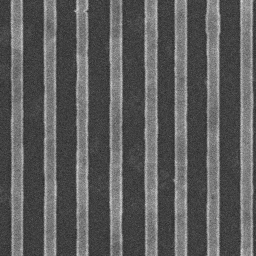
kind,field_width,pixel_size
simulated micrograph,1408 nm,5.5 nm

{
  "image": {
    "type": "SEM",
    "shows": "parallel lines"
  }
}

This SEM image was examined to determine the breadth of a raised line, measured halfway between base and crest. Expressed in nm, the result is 57.8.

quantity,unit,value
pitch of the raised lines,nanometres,180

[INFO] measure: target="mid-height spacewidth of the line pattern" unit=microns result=0.124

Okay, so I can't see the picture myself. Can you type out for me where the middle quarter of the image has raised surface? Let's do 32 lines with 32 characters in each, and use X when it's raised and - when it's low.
----XX------XX------XXX-----XX--
----XX------XX-------XX-----XX--
----XX------XX-------XX-----XX--
---XXX------XX-------XX-----XX--
---XXX------XX-------XX-----XX--
---XXX------XX-------XX-----XX--
---XXX------XX-------XX-----XX--
---XXX------XX-------XX-----XX--
---XXX------XX-------XX-----XX--
---XXX------XX-------XX-----XX--
---XXX------XX-------XX-----XX--
---XXX------XX------XXX-----XX--
---XXX------XX------XXX-----XX--
---XXX------XX-------XX-----XX--
---XXX------XX-------XX-----XX--
---XXX------XX-------XX-----XX--
----XX------XX------XXX-----XX--
---XXX------XX------XXX-----XX--
---XXX------XX-------XX-----XX--
----XX------XX-------XX-----XX--
---XXX------XX-------XX-----XX--
---XXX------XX-------XX-----XX--
---XXX------XX-------XX-----XX--
---XXX------XX-------XX-----XX--
---XXX------XX-------XX-----XX--
---XXX------XX-------XX-----XX--
---XXX------XX------XXX-----XX--
---XXX------XX------XXX-----XX--
---XXX------XX------XXX-----XX--
---XXX------XX------XXX-----XX--
---XXX------XX------XXX-----XX--
---XXX------XX-------XX-----XX--